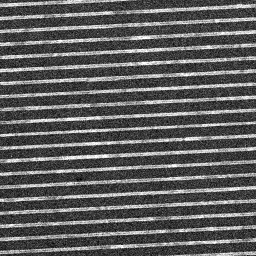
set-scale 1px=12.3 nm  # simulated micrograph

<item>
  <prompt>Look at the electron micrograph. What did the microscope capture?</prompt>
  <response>parallel lines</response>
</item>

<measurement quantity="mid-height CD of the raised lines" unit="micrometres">0.0368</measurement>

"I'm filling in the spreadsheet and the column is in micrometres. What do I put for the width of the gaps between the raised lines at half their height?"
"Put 0.123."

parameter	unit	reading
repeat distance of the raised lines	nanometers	160